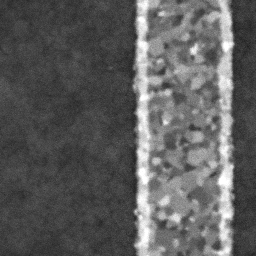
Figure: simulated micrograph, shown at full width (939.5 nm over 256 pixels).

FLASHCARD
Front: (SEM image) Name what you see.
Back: one or a few lines or trenches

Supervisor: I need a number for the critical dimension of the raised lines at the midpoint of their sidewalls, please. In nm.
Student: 298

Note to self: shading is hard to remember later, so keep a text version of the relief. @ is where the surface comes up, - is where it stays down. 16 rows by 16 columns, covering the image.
---------@@@@@--
---------@@@@@--
---------@@@@@--
---------@@@@@--
---------@@@@@--
---------@@@@@--
---------@@@@@--
---------@@@@@--
---------@@@@@--
---------@@@@@--
---------@@@@@--
---------@@@@@--
---------@@@@@--
---------@@@@@--
---------@@@@@--
---------@@@@@--